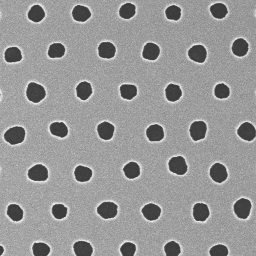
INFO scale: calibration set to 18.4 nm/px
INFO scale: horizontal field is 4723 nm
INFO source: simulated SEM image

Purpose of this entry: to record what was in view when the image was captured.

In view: a regular array of holes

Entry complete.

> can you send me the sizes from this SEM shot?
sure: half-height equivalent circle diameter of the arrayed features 17.7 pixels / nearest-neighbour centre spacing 0.807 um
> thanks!